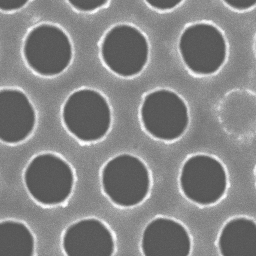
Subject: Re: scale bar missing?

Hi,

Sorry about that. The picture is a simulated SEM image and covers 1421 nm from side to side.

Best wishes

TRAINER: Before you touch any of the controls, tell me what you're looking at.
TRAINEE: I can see a regular array of holes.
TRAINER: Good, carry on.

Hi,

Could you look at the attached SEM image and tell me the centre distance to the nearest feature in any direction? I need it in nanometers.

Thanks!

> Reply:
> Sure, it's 418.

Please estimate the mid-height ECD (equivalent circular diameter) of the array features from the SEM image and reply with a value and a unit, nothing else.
267 nm